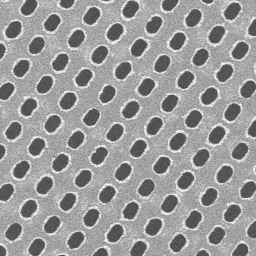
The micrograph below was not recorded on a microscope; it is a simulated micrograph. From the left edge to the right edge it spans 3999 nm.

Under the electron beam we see a regular array of holes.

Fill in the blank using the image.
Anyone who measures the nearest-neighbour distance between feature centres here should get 431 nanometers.